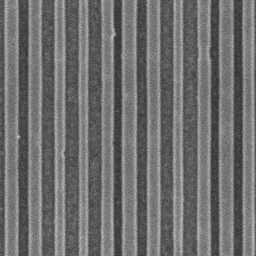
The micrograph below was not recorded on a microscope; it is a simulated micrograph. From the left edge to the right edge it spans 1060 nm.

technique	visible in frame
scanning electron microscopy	parallel lines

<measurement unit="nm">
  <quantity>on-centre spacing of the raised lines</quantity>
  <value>98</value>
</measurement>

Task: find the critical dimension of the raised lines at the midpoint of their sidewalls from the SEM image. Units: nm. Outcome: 50.7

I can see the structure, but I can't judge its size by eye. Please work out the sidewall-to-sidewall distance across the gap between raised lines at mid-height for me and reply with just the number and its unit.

0.0507 microns